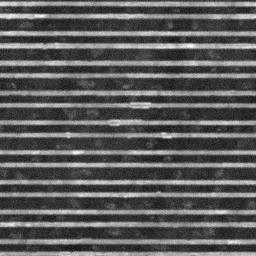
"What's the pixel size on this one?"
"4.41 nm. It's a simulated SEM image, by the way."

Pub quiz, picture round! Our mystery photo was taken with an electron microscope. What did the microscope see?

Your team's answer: parallel lines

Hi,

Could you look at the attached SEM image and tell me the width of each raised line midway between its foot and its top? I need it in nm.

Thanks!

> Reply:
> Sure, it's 17.1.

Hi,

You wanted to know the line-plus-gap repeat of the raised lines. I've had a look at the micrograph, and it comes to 14.9 px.